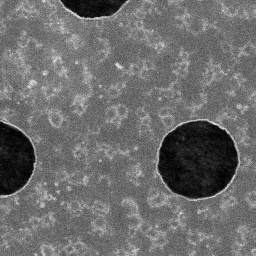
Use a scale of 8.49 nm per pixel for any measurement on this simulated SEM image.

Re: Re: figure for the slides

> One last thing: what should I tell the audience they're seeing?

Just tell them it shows holes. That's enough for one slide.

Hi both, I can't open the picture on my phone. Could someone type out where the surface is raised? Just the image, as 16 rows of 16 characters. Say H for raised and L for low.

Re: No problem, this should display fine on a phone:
HHHHLLLHHHHHHHHH
HHHHHHHHHHHHHHHH
HHHHHHHHHHHHHHHH
HHHHHHHHHHHHHHHH
HHHHHHHHHHHHHHHH
HHHHHHHHHHHHHHHH
HHHHHHHHHHHHHHHH
HHHHHHHHHHHHHHHH
LLHHHHHHHHLLLLHH
LLHHHHHHHHLLLLLH
LLHHHHHHHHLLLLLH
LLHHHHHHHHLLLLHH
HHHHHHHHHHHHHHHH
HHHHHHHHHHHHHHHH
HHHHHHHHHHHHHHHH
HHHHHHHHHHHHHHHH